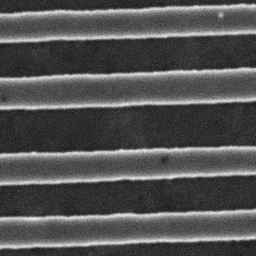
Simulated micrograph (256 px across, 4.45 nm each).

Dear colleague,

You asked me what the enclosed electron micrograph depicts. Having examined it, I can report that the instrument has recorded lines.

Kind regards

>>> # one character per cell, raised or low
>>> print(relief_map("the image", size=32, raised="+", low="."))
................................
.....+++++++++++++++++++++++++++
++++++++++++++++++++++++++++++++
++++++++++++++++++++++++++++++++
+++++++++++++++++++++...........
................................
................................
................................
................................
........++++++++++++++++++++++++
++++++++++++++++++++++++++++++++
++++++++++++++++++++++++++++++++
++++++++++++++++++++++++++++++++
+++++++.........................
................................
................................
................................
................................
...........................+++++
++++++++++++++++++++++++++++++++
++++++++++++++++++++++++++++++++
++++++++++++++++++++++++++++++++
++++++++++++++..................
................................
................................
................................
..........................++++++
++++++++++++++++++++++++++++++++
++++++++++++++++++++++++++++++++
++++++++++++++++++++++++++++++++
++++++++++++....................
................................